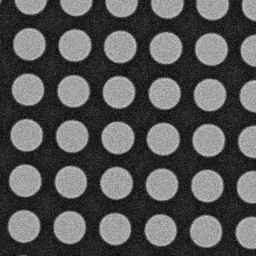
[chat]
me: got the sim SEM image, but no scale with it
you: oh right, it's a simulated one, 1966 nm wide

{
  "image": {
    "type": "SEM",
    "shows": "an array of small figures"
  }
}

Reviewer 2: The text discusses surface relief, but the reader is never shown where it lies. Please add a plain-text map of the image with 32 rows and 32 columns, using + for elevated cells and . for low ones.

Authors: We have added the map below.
..++++..+++..++++..++++..++++.++
...++...+++...+++..+++...+++..++
................................
................................
..+++...+++...++....++...++.....
..++++.++++..++++..++++..+++..++
..+++...+++..++++..++++.++++..++
.........+....++....++...+++...+
................................
...+............................
..+++..++++..+++...+++...+++...+
..+++..++++..++++..+++..++++..++
..+++...+++..++++..+++..++++..++
....................+....++....+
................................
..+++...++....++....+...........
.++++..++++..++++..+++..++++..++
..+++..++++..++++.++++..++++..++
..++....++...+++...+++..++++..++
...............................+
................................
..+++..+++...+++...++....++....+
.++++..++++..+++..++++..++++..++
.++++..++++..+++..++++..++++..++
...+....++...+++...+++..+++...++
................................
..++............................
.++++..+++...+++...++...+++...++
.++++..++++.++++..++++..++++..++
.++++..+++...+++..++++..++++..++
...................++....++...++
................................